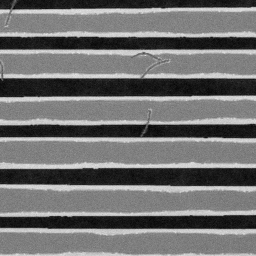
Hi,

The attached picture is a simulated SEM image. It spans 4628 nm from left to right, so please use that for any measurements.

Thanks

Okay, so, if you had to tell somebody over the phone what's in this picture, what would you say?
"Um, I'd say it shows lines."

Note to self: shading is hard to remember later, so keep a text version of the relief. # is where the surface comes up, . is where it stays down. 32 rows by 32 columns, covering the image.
................................
################################
################################
################################
.......................###......
................................
################..##############
################################
################################
################################
................................
................................
################################
################################
################################
..................#.............
................................
###############################.
################################
################################
################################
................................
................................
####################....#####...
################################
################################
################################
................................
................................
################################
################################
################################